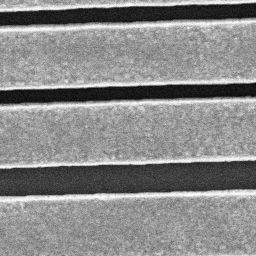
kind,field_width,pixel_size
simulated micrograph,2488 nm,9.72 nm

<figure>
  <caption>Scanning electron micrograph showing lines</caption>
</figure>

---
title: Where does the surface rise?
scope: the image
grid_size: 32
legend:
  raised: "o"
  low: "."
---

oooooooooooooooooooooooo........
................................
................................
oooooooooooooooooooooooooooooooo
oooooooooooooooooooooooooooooooo
oooooooooooooooooooooooooooooooo
oooooooooooooooooooooooooooooooo
oooooooooooooooooooooooooooooooo
oooooooooooooooooooooooooooooooo
oooooooooooooooooooooooooooooooo
ooooooooooooooooooooo...........
................................
........................oooooooo
oooooooooooooooooooooooooooooooo
oooooooooooooooooooooooooooooooo
oooooooooooooooooooooooooooooooo
oooooooooooooooooooooooooooooooo
oooooooooooooooooooooooooooooooo
oooooooooooooooooooooooooooooooo
oooooooooooooooooooooooooooooooo
oooooooooooooooooo..............
................................
................................
................................
..............oooooooooooooooooo
oooooooooooooooooooooooooooooooo
oooooooooooooooooooooooooooooooo
oooooooooooooooooooooooooooooooo
oooooooooooooooooooooooooooooooo
oooooooooooooooooooooooooooooooo
oooooooooooooooooooooooooooooooo
oooooooooooooooooooooooooooooooo